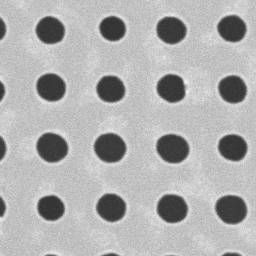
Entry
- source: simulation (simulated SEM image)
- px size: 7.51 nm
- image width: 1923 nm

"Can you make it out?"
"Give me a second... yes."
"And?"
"a regular array of holes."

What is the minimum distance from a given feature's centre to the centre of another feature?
439 nanometres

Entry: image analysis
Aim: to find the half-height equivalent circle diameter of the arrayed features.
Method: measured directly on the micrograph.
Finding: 211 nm